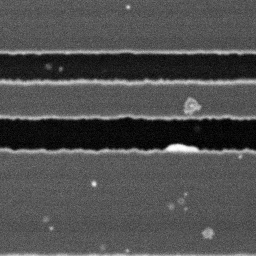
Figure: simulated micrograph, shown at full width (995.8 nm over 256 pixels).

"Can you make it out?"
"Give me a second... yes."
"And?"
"lines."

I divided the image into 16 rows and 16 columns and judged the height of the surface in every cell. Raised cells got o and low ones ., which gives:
oooooooooooooooo
oooooooooooooooo
oooooooooooooooo
................
................
oooooooooooooooo
oooooooooooooooo
................
................
oooooooooooooooo
oooooooooooooooo
oooooooooooooooo
oooooooooooooooo
oooooooooooooooo
oooooooooooooooo
oooooooooooooooo